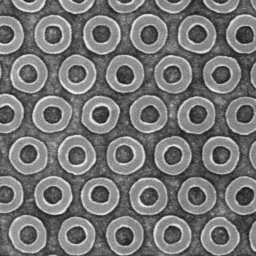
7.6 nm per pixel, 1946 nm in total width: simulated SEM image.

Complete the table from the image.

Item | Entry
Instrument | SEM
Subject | a regular array of ring-shaped raised bodies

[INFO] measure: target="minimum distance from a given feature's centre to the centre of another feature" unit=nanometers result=351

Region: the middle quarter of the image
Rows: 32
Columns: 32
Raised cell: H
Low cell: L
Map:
HHLLHHHLLLLHHHLLHHHLLLLHHHLLHHHL
HLLLLLHHLLLHHLLLLHHHLLLHHLLLLHHH
HLLLLLHHLLLHHLLLLLHHLLLHHLLLLHHH
HLLLLHHHLLLHHLLLLLHHLLLHHLLLLHHH
HHLLHHHLLLLHHHLLLHHLLLLHHHLLHHHH
HHHHHHHLLLLLHHHHHHHLLLLLHHHHHHHL
LHHHHHLLLLLLLHHHHHLLLLLLLHHHHHLL
LLLLLLLLLLLLLLLLLLLLLLLLLLLLLLLL
LLLLLLLHHHHLLLLLLLLHHHHHLLLLLLLL
HLLLLLHHHHHHHLLLLLHHHHHHHLLLLLHH
HHLLLHHHHLLHHLLLLHHHHLHHHLLLLHHH
HHLLLHHLLLLHHHLLHHHLLLLHHHLLLHHL
HHLLLHHLLLLLHHLLHHHLLLLLHHLLLHHL
HHLLLHHLLLLHHLLLLHHLLLLLHHLLLHHL
HLLLLHHLLLLHHLLLLHHHLLLHHHLLLHHH
HLLLLHHHHHHHHLLLLLHHHHHHHLLLLHHH
LLLLLLHHHHHHLLLLLLLHHHHLLLLLLLHH
LLLLLLLLLLLLLLLLLLLLLLLLLLLLLLLL
LHHHHLLLLLLLLLHHLLLLLLLLLLHHHLLL
HHHHHHLLLLLLHHHHHHLLLLLLHHHHHHLL
HHHLHHHLLLLHHHLLHHHLLLLHHHHLHHHL
HLLLLHHLLLLHHLLLLHHHLLLHHLLLLHHH
HLLLLHHHLLLHHLLLLLHHLLLHHLLLLLHH
HLLLLLHHLLLHHLLLLHHHLLLHHLLLLLHH
HLLLLHHLLLLHHLLLLHHHLLLHHLLLLHHL
HHLLHHHLLLLHHHHHHHHLLLLHHHHHHHHL
HHHHHHLLLLLLHHHHHHLLLLLLHHHHHHLL
LLLLLLLLLLLLLLLLLLLLLLLLLLHHHLLL
LLLLLLLLLLLLLLLLLLLLLLLLLLLLLLLL
LLLLLLHHHHHHLLLLLLHHHHHHLLLLLLHH
HLLLLHHHLLHHHLLLLHHHHHHHHLLLLHHH
HHLLLHHLLLLHHLLLLHHHLLLHHLLLLHHL